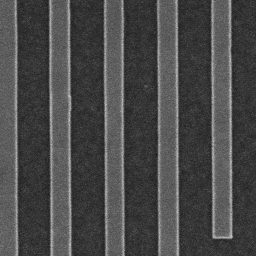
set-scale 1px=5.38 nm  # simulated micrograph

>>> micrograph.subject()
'parallel lines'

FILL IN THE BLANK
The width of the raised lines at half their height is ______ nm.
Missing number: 100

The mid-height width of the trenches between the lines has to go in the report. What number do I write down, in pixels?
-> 35.5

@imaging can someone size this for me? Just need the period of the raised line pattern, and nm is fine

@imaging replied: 290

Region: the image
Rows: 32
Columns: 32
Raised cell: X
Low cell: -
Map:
XX----XXX----XX-----XX-----XX---
XX----XXX----XX-----XX-----XX---
XX----XXX----XX-----XX-----XX---
XX----XXX----XX-----XX-----XX---
XX----XXX----XX-----XX-----XX---
XX----XXX----XX-----XX-----XX---
XX----XXX----XX-----XX-----XX---
XX----XXX----XX-----XX-----XX---
XX----XXX----XX-----XX-----XX---
XX----XXX----XX-----XX-----XX---
XX----XXX----XX-----XX-----XX---
XX----XXX----XX-----XX-----XX---
XX----XXX----XX-----XX-----XX---
XX----XXX----XX-----XX-----XX---
XX----XXX----XX-----XX-----XX---
XX----XXX----XX-----XX-----XX---
XX----XXX----XX-----XX-----XX---
XX----XXX----XX-----XX-----XX---
XX----XXX----XX-----XX-----XX---
XX----XXX----XX-----XX-----XX---
XX----XXX----XX-----XX-----XX---
XX----XXX----XX-----XX-----XX---
XX----XXX----XX-----XX-----XX---
XX----XXX----XX-----XX-----XX---
XX----XXX----XX-----XX-----XX---
XX----XXX----XX-----XX-----XX---
XX----XXX----XX-----XX-----XX---
XX----XXX----XX-----XX-----XX---
XX----XXX----XX-----XX-----XX---
XX----XXX----XX-----XX-----XX---
XX----XXX----XX-----XX----------
XX----XXX----XX-----XX----------